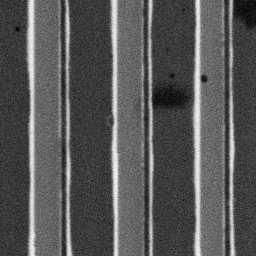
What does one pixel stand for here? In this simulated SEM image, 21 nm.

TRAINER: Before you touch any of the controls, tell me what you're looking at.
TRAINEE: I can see lines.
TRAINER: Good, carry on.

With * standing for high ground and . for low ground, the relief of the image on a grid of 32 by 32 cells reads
....****.......****......****...
....****.......****......****...
....****.......****......****...
....****.......****......****...
....****.......****......****...
....****.......****......****...
....****.......****......****...
....****.......****......****...
....****.......****......****...
....****.......****......****...
....****.......****......****...
....****.......****......****...
....****.......****......****...
....****.......****......****...
....****.......****......****...
....****.......****......****...
....****.......****......****...
....****.......****......****...
....****.......****......****...
....****.......****......****...
....****.......****......****...
....****.......****......****...
....****.......****......****...
....****.......****......****...
....****.......****......****...
....****.......****......****...
....****.......****......****...
....****.......****......****...
....****.......****......****...
....****.......****......****...
....****.......****......****...
....****.......****......****...